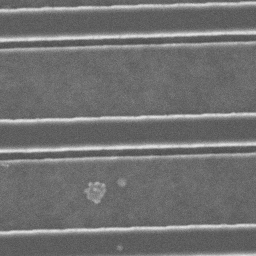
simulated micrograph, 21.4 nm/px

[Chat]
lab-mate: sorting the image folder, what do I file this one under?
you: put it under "lines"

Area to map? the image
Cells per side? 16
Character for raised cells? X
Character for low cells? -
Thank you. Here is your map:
---XXXXXXXXXXXXX
XXXXXXXXXXXXXXXX
X---------------
----------------
----------------
----------------
----------------
-XXXXXXXXXXXXXXX
XXXXXXXXXXXXXXXX
----------------
----------------
----------------
----------------
----------------
-XXXXXXXXXXXXXXX
XXXXXXXXXXXXXXXX